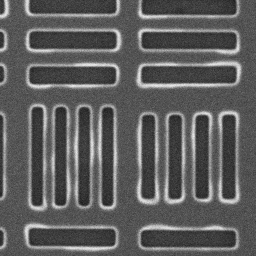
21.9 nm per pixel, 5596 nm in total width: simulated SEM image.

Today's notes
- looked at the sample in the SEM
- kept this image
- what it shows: groups of lines, slits or small figures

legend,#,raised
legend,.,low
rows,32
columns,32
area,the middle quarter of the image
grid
............########............
.............######.............
.............######.............
.............######.............
.............######.............
###.############################
################################
################################
################################
################################
################################
.###...###..####################
.##....##....#######..#####.####
.##....##....######....###...###
.##....##....######....###....##
.##....##....######....###....##
.##....##....######....###....##
.##....##....######....###....##
.##....##....######....###....##
.##....##....######....###....##
.##....##....######....###....##
.##....##....######....###....##
.##....##....######....###....##
.##....##....######....###....##
.##....##....######....###....##
.##....##....######....###....##
.##....##....######....###....##
.##....##....######....###....##
.##....##....######....###....##
.##....##....######....###....##
.##....##....######....###....##
.##....##....######....###....##